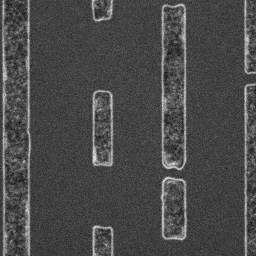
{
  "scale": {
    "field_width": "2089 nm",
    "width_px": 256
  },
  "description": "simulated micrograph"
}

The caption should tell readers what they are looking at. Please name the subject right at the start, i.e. one or a few lines or trenches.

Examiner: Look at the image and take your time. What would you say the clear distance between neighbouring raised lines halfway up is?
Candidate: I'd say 496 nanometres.